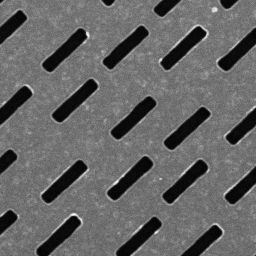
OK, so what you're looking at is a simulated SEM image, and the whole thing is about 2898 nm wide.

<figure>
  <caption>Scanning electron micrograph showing a regular array of holes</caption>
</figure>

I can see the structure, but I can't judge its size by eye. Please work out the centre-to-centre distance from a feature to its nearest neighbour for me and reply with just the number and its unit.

613 nm